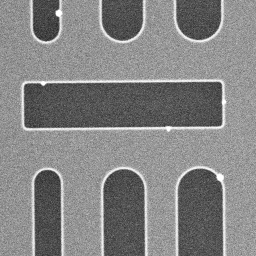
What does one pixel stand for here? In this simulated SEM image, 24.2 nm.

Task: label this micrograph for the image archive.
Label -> groups of lines, slits or small figures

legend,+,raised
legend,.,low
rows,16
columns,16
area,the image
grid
++..++...++...++
++..++...++...++
+++++++.++++.+++
++++++++++++++++
++++++++++++++++
++............++
+.............++
+.............++
++++++++++++++++
++++++++++++++++
++++++++++++++++
++..+++..++...++
++..++...++...++
++..++...++...++
++..++...++...++
++..++...++...++